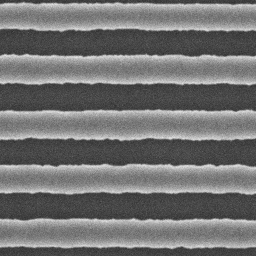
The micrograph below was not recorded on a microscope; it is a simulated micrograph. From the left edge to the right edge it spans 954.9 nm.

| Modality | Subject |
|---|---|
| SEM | lines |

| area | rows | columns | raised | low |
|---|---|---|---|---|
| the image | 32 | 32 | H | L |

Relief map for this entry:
HHHHHHHHHHHHHHHHHHHLLLLLHLLLLLLL
HHHHHHHHHHHHHHHHHHHHHHHHHHHHHHHH
HHHHHHHHHHHHHHHHHHHHHHHHHHHHHHHH
HHHHHHHHHHHHHHHHHHHHHHHHHHHHHHHH
LLLLLLLLLLLLLLLLLLLLLLLLLLLLLLLL
LLLLLLLLLLLLLLLLLLLLLLLLLLLLLLLL
LLLLLLLLLLLLLLLLLLLLLLLLLLLLLLLL
HHHHHHHHHHHHHHHHHHHHHHHHHHHHHHHH
HHHHHHHHHHHHHHHHHHHHHHHHHHHHHHHH
HHHHHHHHHHHHHHHHHHHHHHHHHHHHHHHH
LLLLLLLLLLLLLLLLLLLLLLLLLLLLLLHH
LLLLLLLLLLLLLLLLLLLLLLLLLLLLLLLL
LLLLLLLLLLLLLLLLLLLLLLLLLLLLLLLL
LLLLLLLLLLLLLLLLLLLLLLLLLLLLLLLL
HHHHHHHHHHHHHHHHHHHHHHHHHHHHHHHH
HHHHHHHHHHHHHHHHHHHHHHHHHHHHHHHH
HHHHHHHHHHHHHHHHHHHHHHHHHHHHHHHH
LLLLLLLLLLLLLLLHLLLLLLLLHLLHHLLL
LLLLLLLLLLLLLLLLLLLLLLLLLLLLLLLL
LLLLLLLLLLLLLLLLLLLLLLLLLLLLLLLL
LLLLLLLLLLLLLLLLLLLLLLLLLLLLLLLL
HHHHHHHHHHHHHHHHHHHHHHHHHHHHHHHH
HHHHHHHHHHHHHHHHHHHHHHHHHHHHHHHH
HHHHHHHHHHHHHHHHHHHHHHHHHHHHHHHH
LLLLLLLLLLLLLLLLLLLLLLLLLLLLLLLL
LLLLLLLLLLLLLLLLLLLLLLLLLLLLLLLL
LLLLLLLLLLLLLLLLLLLLLLLLLLLLLLLL
HLLLHHHLHHHHLLHLHLLLLLLLHHHHHLLL
HHHHHHHHHHHHHHHHHHHHHHHHHHHHHHHH
HHHHHHHHHHHHHHHHHHHHHHHHHHHHHHHH
HHHHHHHHHHHHHHHHHHHHHHHHHHHHHHHH
LLLLLLLLLLLLLLLLLLLLLLLLLLLLLLLL